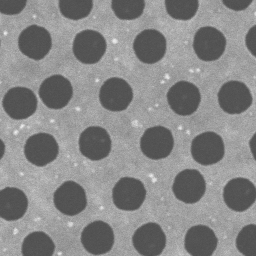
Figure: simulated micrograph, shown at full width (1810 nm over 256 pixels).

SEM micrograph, a regular array of holes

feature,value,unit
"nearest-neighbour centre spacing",366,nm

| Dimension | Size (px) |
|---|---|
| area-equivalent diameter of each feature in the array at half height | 34.7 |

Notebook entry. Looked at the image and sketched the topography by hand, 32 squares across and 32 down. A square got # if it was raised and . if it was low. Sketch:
...####.....##....###....###...#
...#####...###....###....#######
#########.#####.######..########
###...###################..####.
##....###....####...####....###.
##....###....####....###....###.
###...###....####....###....###.
####.#####...####...#####..#####
################################
######..########################
#####....####...######..####...#
#...#....###.....####....##....#
.........###....#####....##.....
.....#..#####...#####....###...#
#...############################
################################
##########...#####...#####.#####
###....###....####....##....###.
.##....###....####....##....###.
###....###...#####...###....####
####..###################..#####
######################...#######
###############..#####....###..#
..#####...####....###.....##....
...####....###....####...###....
...####....###....##########....
...#####..######################
#.##############################
###########...###...####..####..
###...####....###....##....###..
###....###....###....##....###..
###....####...###...###....###..